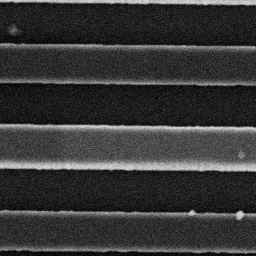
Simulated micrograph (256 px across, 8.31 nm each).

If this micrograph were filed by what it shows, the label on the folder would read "lines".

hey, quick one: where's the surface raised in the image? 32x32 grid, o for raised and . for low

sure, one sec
................................
................................
................................
................................
................................
ooo.............................
oooooooooooooooooooooooooooooooo
oooooooooooooooooooooooooooooooo
oooooooooooooooooooooooooooooooo
oooooooooooooooooooooooooooooooo
.............ooooooooooooooooooo
................................
................................
................................
................................
................................
oooooooooooooooooooooooooooooooo
oooooooooooooooooooooooooooooooo
oooooooooooooooooooooooooooooooo
oooooooooooooooooooooooooooooooo
oooooooooooooooooooooooooooooooo
................................
................................
................................
................................
................................
oooooo.oo.......................
oooooooooooooooooooooooooooooooo
oooooooooooooooooooooooooooooooo
oooooooooooooooooooooooooooooooo
oooooooooooooooooooooooooooooooo
........................oo.ooooo